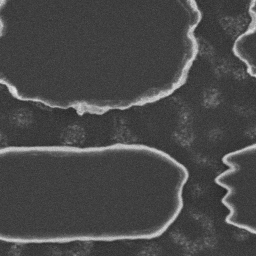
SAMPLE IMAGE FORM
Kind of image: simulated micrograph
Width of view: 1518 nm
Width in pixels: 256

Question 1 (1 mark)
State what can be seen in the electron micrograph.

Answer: one or a few lines or trenches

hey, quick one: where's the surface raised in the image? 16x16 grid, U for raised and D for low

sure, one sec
UUUUUUUUUUUUDDDD
UUUUUUUUUUUUDDDD
UUUUUUUUUUUUDDDU
UUUUUUUUUUUUDDDU
UUUUUUUUUUUUDDDD
DUUUUUUUUUUDDDDD
DDDUUUUUUDDDDDDD
DDDDDDDDDDDDDDDD
DDDDDDDDDDDDDDDD
UUUUUUUUUUDDDDDU
UUUUUUUUUUUDDDUU
UUUUUUUUUUUDDDUU
UUUUUUUUUUUDDDUU
UUUUUUUUUUUDDDUU
UUUUUUUUUUDDDDDD
DDDDDDDDDDDDDDDD